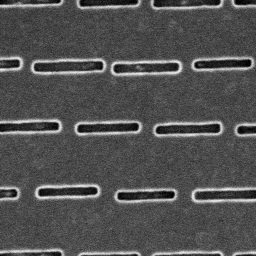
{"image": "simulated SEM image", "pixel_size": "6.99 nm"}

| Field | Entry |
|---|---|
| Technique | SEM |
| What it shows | holes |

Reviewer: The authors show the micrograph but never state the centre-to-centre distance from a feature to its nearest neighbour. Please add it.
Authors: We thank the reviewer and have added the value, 520 nm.